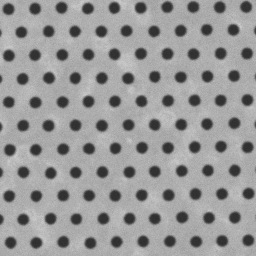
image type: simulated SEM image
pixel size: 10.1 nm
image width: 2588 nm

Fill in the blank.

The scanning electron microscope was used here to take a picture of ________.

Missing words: a regular array of holes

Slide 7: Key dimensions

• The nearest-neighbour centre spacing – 264 nm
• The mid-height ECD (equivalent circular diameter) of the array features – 118 nanometers